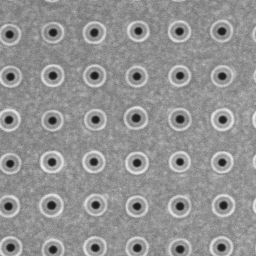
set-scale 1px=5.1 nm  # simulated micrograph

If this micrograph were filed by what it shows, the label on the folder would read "a regular array of ring-shaped raised bodies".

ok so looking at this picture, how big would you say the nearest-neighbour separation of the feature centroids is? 0.214 microns